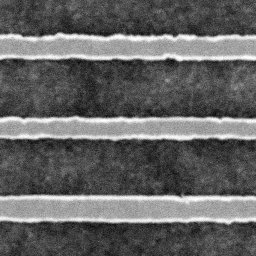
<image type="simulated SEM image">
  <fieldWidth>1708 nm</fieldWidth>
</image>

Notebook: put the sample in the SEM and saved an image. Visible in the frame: one or a few lines or trenches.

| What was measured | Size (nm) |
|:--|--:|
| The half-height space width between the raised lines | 408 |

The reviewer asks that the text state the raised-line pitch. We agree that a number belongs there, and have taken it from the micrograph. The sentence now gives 539 nm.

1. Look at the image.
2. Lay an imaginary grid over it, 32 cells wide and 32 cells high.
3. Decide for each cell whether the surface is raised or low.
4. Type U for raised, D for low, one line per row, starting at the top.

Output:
DDDDDDDDDDDDDDDDDDDDDDDDDDDDDDDD
DDDDDDDDDDDDDDDDDDDDDDDDDDDDDDDD
DDDDDDDDDDDDDDDDDDDDDDDDDDDDDDDD
DDDDDDDDDDDDDDDDDDDDDDDDDDDDDDDD
DUDDDDDUDDDDDDDDDDDDDDUDDDDDDDDD
UUUUUUUUUUUUUUUUUUUUUUUUUUUUUUUU
UUUUUUUUUUUUUUUUUUUUUUUUUUUUUUUU
DDDDDDDDDDDDDDDDDDDDDDDDDDDDDDDD
DDDDDDDDDDDDDDDDDDDDDDDDDDDDDDDD
DDDDDDDDDDDDDDDDDDDDDDDDDDDDDDDD
DDDDDDDDDDDDDDDDDDDDDDDDDDDDDDDD
DDDDDDDDDDDDDDDDDDDDDDDDDDDDDDDD
DDDDDDDDDDDDDDDDDDDDDDDDDDDDDDDD
DDDDDDDDDDDDDDDDDDDDDDDDDDDDDDDD
DDDDDDDDDDDDDDDDDDDDDDDDDDDDDDDD
UUUUUUUUUUUUUUUUUUUUUUUUUUUUUUUU
UUUUUUUUUUUUUUUUUUUUUUUUUUUUUUUU
DDDDDDDDDDDDDDDDDDDDDDDDDDDDDDDD
DDDDDDDDDDDDDDDDDDDDDDDDDDDDDDDD
DDDDDDDDDDDDDDDDDDDDDDDDDDDDDDDD
DDDDDDDDDDDDDDDDDDDDDDDDDDDDDDDD
DDDDDDDDDDDDDDDDDDDDDDDDDDDDDDDD
DDDDDDDDDDDDDDDDDDDDDDDDDDDDDDDD
DDDDDDDDDDDDDDDDDDDDDDDDDDDDDDDD
DDDDDDDDDDDDDDDDDDDDDDDDDDDDDDDD
UUUUUUUUUUUUUUUUUUUUUUUUUUUUUUUU
UUUUUUUUUUUUUUUUUUUUUUUUUUUUUUUU
DDUUUDDDDDDDUUUUUUUUUUUUUDUUUUUU
DDDDDDDDDDDDDDDDDDDDDDDDDDDDDDDD
DDDDDDDDDDDDDDDDDDDDDDDDDDDDDDDD
DDDDDDDDDDDDDDDDDDDDDDDDDDDDDDDD
DDDDDDDDDDDDDDDDDDDDDDDDDDDDDDDD